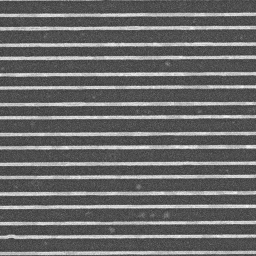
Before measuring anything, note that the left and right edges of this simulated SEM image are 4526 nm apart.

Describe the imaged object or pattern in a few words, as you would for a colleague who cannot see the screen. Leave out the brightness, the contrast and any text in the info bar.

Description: parallel lines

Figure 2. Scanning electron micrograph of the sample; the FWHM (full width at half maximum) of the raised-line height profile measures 48.6 nanometers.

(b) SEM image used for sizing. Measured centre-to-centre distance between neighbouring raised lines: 263 nanometers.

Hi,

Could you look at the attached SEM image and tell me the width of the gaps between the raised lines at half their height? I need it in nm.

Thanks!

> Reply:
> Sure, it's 239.